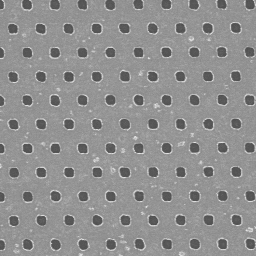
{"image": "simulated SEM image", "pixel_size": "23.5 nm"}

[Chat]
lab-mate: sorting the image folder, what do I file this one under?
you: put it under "a regular array of holes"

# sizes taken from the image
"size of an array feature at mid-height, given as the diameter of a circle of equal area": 244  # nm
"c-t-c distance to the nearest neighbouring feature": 27.4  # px